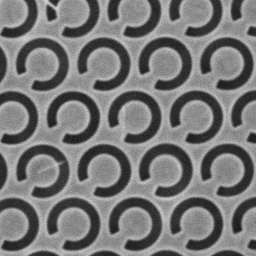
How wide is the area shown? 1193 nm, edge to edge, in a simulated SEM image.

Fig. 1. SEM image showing an array of small figures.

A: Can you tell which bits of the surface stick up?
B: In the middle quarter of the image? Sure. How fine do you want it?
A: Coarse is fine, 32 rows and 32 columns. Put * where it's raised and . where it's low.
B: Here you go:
.**...********...*...********...
.**...********...**...*******...
.***.********...***.*********...
************....***********....*
********.......********.......**
*******.......*********......***
********....*****.******...*****
.....*********.......*********..
.......******.........******....
.***....****....***....*****....
*****...***....******...***...**
******...**...*******...***..***
******...**...********..**...***
***.**...**...********...*...***
******...**...********..**...***
******...**..********...***..***
*****...************....********
..*.....********.......********.
.......********.......********..
.....**********......*********..
*******......*********.......***
******........*******.........**
*****..........*****...........*
.***...******...***....****.....
.***...******....**...******....
.**...********...**...*******...
..*...********...*....*******...
..*...********...*....*******...
.**...********...**...*******...
.************...************....
***********.....*******........*
********.......********.......**